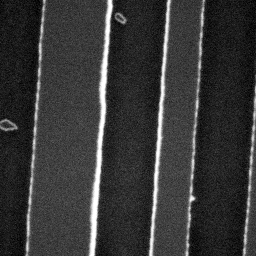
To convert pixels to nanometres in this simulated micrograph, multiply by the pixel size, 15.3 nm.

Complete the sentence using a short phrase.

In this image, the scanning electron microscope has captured lines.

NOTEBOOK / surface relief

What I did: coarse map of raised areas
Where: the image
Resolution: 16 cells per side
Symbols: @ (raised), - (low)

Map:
---@@@@---@@@---
---@@@@---@@@---
---@@@@---@@@---
--@@@@@---@@@---
--@@@@@---@@----
--@@@@@---@@----
--@@@@@---@@----
--@@@@----@@----
--@@@@----@@----
--@@@@----@@----
--@@@@----@@----
--@@@@----@@----
--@@@@----@@----
--@@@@----@@---@
--@@@@---@@@---@
--@@@@---@@@---@